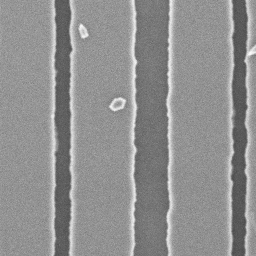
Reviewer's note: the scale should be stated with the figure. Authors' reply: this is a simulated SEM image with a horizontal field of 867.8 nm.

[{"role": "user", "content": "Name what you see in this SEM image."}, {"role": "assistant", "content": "lines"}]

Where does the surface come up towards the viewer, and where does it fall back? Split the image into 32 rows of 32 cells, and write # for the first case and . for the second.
#######..########....########..#
#######..########....########..#
#######..########....########..#
#######..########....########..#
#######..########....########..#
#######..########....########..#
#######..########....########..#
#######..########....########..#
#######..########....########..#
#######..########....########..#
#######..########....########..#
#######..########....########..#
#######..########....########..#
#######..########....########..#
#######..########....########..#
#######..########....########..#
#######..########....########..#
#######..########....########..#
#######..########....########..#
#######..########....########..#
#######..########....########..#
#######..########....########..#
#######..########....########..#
#######..########....########..#
#######..########....########..#
#######..########....########..#
#######..########....########..#
#######..########....########..#
#######..########....########..#
#######..########....########..#
#######..########....########..#
#######..########....########..#